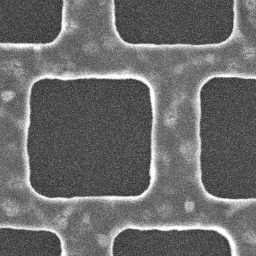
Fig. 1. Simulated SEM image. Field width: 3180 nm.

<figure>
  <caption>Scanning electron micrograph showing holes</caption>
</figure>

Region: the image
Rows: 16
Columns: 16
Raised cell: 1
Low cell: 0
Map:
0000111000000001
0000111000000001
0001111100000011
1111111111111111
1111111111111111
1100000001111000
1100000001110000
1100000000111000
1100000001111000
1100000000111000
1100000001111000
1100000001111000
1111111111111111
1111111111111111
0001111100000011
0000111000000011